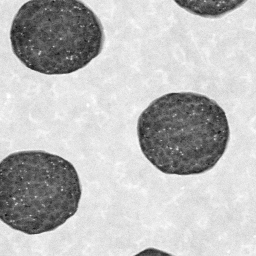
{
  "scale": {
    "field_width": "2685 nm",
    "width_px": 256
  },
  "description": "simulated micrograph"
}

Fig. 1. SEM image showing holes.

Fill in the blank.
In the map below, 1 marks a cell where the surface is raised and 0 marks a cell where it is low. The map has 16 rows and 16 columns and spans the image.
1000011111100001
1000001111111111
1000001111111111
1000001111111111
1100111111111111
1111111111111111
1111111110000011
1111111110000011
1111111110000011
1001111110000011
0000011111000111
0000011111111111
0000011111111111
0000111111111111
1001111111111111
1111111111111111